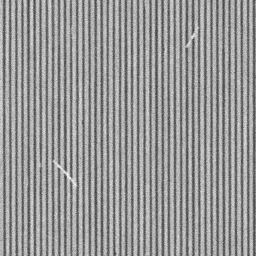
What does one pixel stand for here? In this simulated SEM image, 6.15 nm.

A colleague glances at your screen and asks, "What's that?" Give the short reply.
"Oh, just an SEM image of parallel lines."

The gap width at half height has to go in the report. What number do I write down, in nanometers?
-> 19.2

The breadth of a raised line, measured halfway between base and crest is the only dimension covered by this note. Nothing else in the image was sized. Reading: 19.2 nanometres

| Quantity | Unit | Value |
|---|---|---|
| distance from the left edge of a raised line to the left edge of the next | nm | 37.5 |